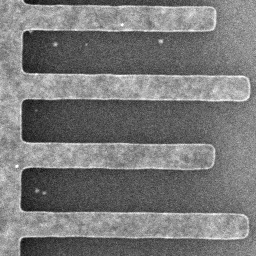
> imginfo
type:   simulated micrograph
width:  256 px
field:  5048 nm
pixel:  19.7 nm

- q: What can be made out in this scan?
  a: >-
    groups of lines, slits or small figures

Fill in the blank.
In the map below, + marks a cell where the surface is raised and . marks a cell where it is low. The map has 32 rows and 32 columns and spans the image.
+++.............................
+++++++++++++++++++++++++++.....
+++++++++++++++++++++++++++.....
+++++++++++++++++++++++++++.....
+++.............................
+++.............................
+++.............................
+++.............................
+++.............................
+++++++++++++++++++++...++......
+++++++++++++++++++++++++++++++.
+++++++++++++++++++++++++++++++.
+++.....................+++++++.
+++.............................
+++.............................
+++.............................
+++.............................
+++.............................
+++++++++++++++++++++++++++.....
+++++++++++++++++++++++++++.....
+++++++++++++++++++++++++++.....
+++.............................
++..............................
+++.............................
++..............................
++..............................
+++.............................
+++++++++++++++++++++++++++++++.
+++++++++++++++++++++++++++++++.
++++++.++.+++++++++++++++++++++.
++..............................
++..............................